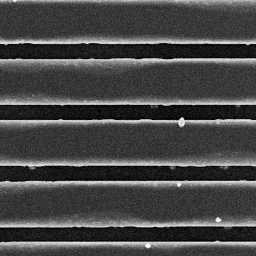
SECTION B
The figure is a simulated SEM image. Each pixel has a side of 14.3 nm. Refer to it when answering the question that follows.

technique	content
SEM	lines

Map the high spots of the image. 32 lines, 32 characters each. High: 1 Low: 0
11111111111111111111111111111111
11111111111111111111111111111111
11111111111111111111111111111111
11111111111111111111111111111111
11111111111111111111111111111111
00000000000000000000000000000000
00000000000000000000000000000000
00000000000000011111111111111111
11111111111111111111111111111111
11111111111111111111111111111111
11111111111111111111111111111111
11111111111111111111111111111111
11111111111111111111111111111111
00000000000000000000000000000000
00000000000000000000000000000000
11111111111111111111111111111111
11111111111111111111111111111111
11111111111111111111111111111111
11111111111111111111111111111111
11111111111111111111111111111111
11111111111111111111111111111111
00000000000000000000000000000000
00000000000000000000000000000000
11111111111111111111111111111111
11111111111111111111111111111111
11111111111111111111111111111111
11111111111111111111111111111111
11111111111111111111111111111111
00000000000000000000000000000000
00000000000000000000000000000000
11111111111111111111111111111111
11111111111111111111111111111111